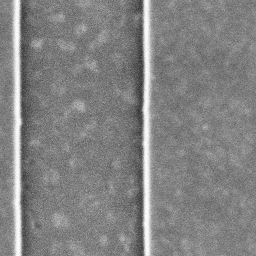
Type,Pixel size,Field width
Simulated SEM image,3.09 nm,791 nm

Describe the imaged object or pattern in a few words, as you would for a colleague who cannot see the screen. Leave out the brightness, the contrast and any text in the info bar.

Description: one or a few lines or trenches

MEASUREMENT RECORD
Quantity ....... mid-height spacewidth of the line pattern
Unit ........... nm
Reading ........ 396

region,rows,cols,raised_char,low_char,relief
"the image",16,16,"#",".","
#........#######
#........#######
#........#######
#........#######
#........#######
#........#######
#........#######
#........#######
#........#######
#........#######
#........#######
#........#######
#........#######
#........#######
#........#######
#........#######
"